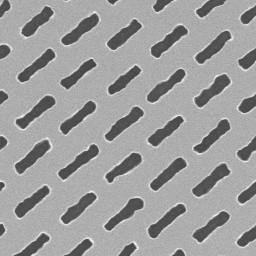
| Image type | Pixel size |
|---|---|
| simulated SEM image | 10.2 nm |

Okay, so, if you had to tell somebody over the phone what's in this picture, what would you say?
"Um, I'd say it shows a regular array of holes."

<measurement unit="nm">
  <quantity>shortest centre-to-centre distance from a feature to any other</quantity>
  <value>440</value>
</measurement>